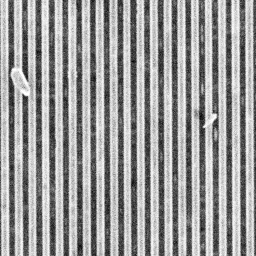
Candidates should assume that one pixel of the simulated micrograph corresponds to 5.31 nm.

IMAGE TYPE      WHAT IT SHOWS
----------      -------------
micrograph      parallel lines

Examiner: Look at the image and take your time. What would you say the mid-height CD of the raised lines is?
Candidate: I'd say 38.5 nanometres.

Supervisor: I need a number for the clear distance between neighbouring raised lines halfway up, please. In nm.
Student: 33.9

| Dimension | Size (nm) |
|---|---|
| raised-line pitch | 72.3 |